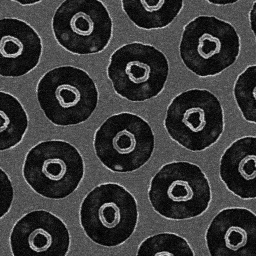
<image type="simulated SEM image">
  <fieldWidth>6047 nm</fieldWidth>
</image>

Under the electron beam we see a regular array of ring-shaped grooves with a dot in the middle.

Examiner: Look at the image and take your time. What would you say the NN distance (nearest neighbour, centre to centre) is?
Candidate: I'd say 72.8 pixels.